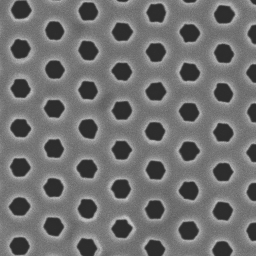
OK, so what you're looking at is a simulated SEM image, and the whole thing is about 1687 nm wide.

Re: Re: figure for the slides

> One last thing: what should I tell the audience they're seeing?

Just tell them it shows a regular array of holes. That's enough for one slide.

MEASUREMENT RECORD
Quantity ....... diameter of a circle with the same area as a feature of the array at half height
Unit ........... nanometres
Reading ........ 125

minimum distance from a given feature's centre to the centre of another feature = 38.7 pixels